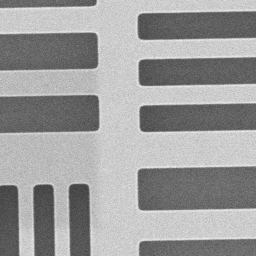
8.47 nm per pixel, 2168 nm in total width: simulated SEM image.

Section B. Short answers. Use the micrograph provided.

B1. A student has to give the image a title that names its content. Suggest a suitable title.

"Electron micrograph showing groups of lines, slits or small figures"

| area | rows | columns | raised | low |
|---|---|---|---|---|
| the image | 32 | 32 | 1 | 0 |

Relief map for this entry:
00000000000011111111111111111111
11111111111111111111111000000000
11111111111111111000000000000000
11111111111111111000000000000000
00000000000011111000000000000000
00000000000011111111111111111111
00000000000011111111111111111111
00000000000011111100000000000000
00000000000011111000000000000000
11111111111111111000000000000000
11111111111111111100000000000000
11111111111111111111111111111111
00000000000011111111111111111111
00000000000011111100000000000000
00000000000011111000000000000000
00000000000011111000000000000000
00000000000111111100001111111111
11111111111111111111111111111111
11111111111111111111111111111111
11111111111111111111111111111111
11111111111111111111111111111111
11111111111111111000000000000000
11111111111111111000000000000000
00110001100111111000000000000000
00110001100111111000000000000000
00110001100111111000000000000000
00110001100111111111111111111111
00110001100111111111111111111111
00110001100111111111111111111111
00010001100111111111111111111111
00010001100111111000000000000000
00010001100111111000000000000000